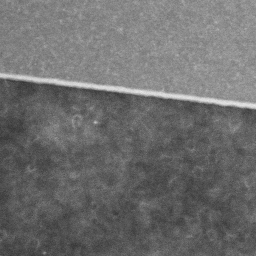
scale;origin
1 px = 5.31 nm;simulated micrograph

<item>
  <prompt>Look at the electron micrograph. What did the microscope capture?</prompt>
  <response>one or a few lines or trenches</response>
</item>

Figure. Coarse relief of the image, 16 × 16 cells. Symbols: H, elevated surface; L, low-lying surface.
HHHHHHHHHHHHHHHH
HHHHHHHHHHHHHHHH
HHHHHHHHHHHHHHHH
HHHHHHHHHHHHHHHH
HHHHHHHHHHHHHHHH
LLLLLLLHHHHHHHHH
LLLLLLLLLLLLLLLH
LLLLLLLLLLLLLLLL
LLLLLLLLLLLLLLLL
LLLLLLLLLLLLLLLL
LLLLLLLLLLLLLLLL
LLLLLLLLLLLLLLLL
LLLLLLLLLLLLLLLL
LLLLLLLLLLLLLLLL
LLLLLLLLLLLLLLLL
LLLLLLLLLLLLLLLL